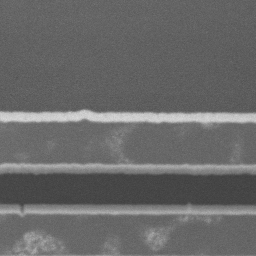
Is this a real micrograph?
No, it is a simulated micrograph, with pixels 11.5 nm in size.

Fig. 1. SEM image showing one or a few lines or trenches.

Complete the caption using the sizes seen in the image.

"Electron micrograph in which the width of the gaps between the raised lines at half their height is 466 nanometers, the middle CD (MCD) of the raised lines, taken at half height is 601 nanometers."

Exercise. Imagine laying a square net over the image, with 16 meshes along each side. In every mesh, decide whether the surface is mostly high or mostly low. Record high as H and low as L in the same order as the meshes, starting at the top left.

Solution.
LLLLLLLLLLLLLLLL
LLLLLLLLLLLLLLLL
LLLLLLLLLLLLLLLL
LLLLLLLLLLLLLLLL
LLLLLLLLLLLLLLLL
LLLLLLLLLLLLLLLL
LLLLLLLLLLLLLLLL
HHHHHHHHHHHHHHHH
HHHHHHHHHHHHHHHH
HHHHHHHHHHHHHHHH
HHHHHHHHHHHHHHHH
LLLLLLLLLLLLLLLL
LLLLLLLLLLLLLLLL
HHHHHHHHHHHHHHHH
HHHHHHHHHHHHHHHH
HHHHHHHHHHHHHHHH